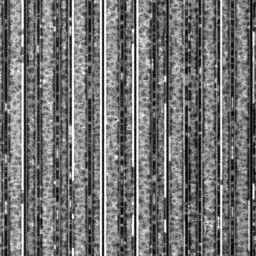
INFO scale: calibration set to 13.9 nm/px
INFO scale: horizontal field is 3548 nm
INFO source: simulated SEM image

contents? parallel lines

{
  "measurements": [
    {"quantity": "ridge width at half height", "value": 64.1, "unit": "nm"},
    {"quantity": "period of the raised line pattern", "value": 0.226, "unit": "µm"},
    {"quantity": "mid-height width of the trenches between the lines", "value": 191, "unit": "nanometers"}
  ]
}